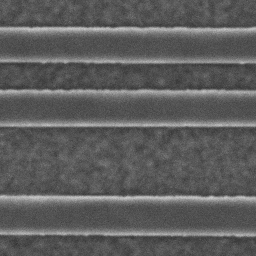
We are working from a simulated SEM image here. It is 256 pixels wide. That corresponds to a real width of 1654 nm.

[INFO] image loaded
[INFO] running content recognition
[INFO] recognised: lines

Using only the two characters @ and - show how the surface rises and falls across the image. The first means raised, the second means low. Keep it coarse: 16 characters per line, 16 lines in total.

----------------
----------------
@@@@@@@@@@@@@@@@
@@@@@@@@@@@@@@@@
----------------
----------------
@@@@@@@@@@@@@@@@
@@@@@@@@@@@@@@@@
----------------
----------------
----------------
----------------
@@@@@@@@@@@@@@@@
@@@@@@@@@@@@@@@@
@@@@@@@@@@@@@@@@
----------------